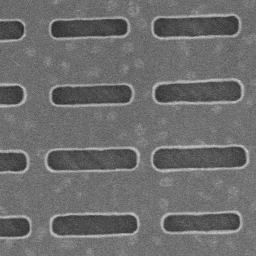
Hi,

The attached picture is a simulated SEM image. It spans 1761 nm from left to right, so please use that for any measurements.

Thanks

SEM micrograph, a regular array of holes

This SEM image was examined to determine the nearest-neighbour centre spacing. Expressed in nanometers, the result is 447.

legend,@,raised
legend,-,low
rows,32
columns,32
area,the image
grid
@@@@@@@@@@@@@@@@@@@@@@@@@@@@@@@@
@@@@@@@@@@@@@@@@@@@@@@@@@@@@@@@@
@@@@@@@@--------@@@-----------@@
---@@@----------@@@-----------@@
---@@@@--------@@@@@---------@@@
@@@@@@@@@@@@@@@@@@@@@@@@@@@@@@@@
@@@@@@@@@@@@@@@@@@@@@@@@@@@@@@@@
@@@@@@@@@@@@@@@@@@@@@@@@@@@@@@@@
@@@@@@@@@@@@@@@@@@@@@@@@@@@@@@@@
@@@@@@@@@@@@@@@@@@@@@@@@@@@@@@@@
@@@@@@@@@@@@@@@@@@@@----------@@
---@@@-----------@@-----------@@
---@@@----------@@@@----------@@
@@@@@@@@@@@@@@@@@@@@@@@@@@@@@@@@
@@@@@@@@@@@@@@@@@@@@@@@@@@@@@@@@
@@@@@@@@@@@@@@@@@@@@@@@@@@@@@@@@
@@@@@@@@@@@@@@@@@@@@@@@@@@@@@@@@
@@@@@@@@@@@@@@@@@@@@@@@@@@@@@@@@
@@@@@@@@@@@@@@--@@@@----------@@
---@@@-----------@@------------@
---@@@-----------@@------------@
--@@@@@@@@@@@@@@@@@@@@@@@@@@@@@@
@@@@@@@@@@@@@@@@@@@@@@@@@@@@@@@@
@@@@@@@@@@@@@@@@@@@@@@@@@@@@@@@@
@@@@@@@@@@@@@@@@@@@@@@@@@@@@@@@@
@@@@@@@@@@@@@@@@@@@@@@@@@@@@@@@@
@@@@@@@@@@@@@@@@@@@@@@@@@@@@@@@@
---@@@@----------@@@----------@@
----@@-----------@@@----------@@
---@@@@--@@-@@@@@@@@@@@@@@@@@@@@
@@@@@@@@@@@@@@@@@@@@@@@@@@@@@@@@
@@@@@@@@@@@@@@@@@@@@@@@@@@@@@@@@